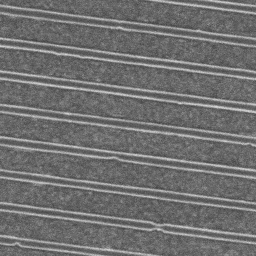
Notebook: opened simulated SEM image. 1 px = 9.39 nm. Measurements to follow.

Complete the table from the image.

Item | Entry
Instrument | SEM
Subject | parallel lines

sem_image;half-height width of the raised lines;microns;0.0732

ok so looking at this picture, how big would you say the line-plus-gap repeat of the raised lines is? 306 nanometers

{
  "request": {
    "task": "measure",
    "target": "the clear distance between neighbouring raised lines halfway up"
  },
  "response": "230 nm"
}